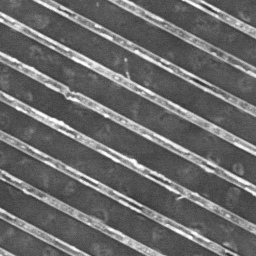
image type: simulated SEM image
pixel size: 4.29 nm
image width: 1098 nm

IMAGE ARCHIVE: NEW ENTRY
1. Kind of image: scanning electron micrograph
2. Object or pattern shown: parallel lines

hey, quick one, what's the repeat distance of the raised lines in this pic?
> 149 nm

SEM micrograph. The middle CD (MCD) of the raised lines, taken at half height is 0.0342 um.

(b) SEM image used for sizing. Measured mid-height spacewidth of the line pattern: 26.7 px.